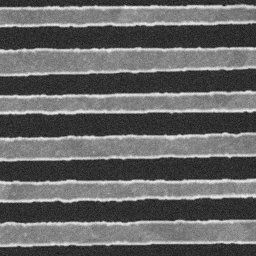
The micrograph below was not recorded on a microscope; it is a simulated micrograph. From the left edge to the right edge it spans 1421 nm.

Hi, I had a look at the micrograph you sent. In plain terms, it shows lines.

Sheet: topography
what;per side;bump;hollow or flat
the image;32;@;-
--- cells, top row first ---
--------------------------------
@@@@@@@@@@@@@@@@@@@@@@@@@@@@@@@@
@@@@@@@@@@@@@@@@@@@@@@@@@@@@@@@@
--------------------------------
--------------------------------
--------------------------------
@@@@@@@@@@@@@@@@@@@@@@@@@@@@@@@@
@@@@@@@@@@@@@@@@@@@@@@@@@@@@@@@@
@@@@@@@@@@@@@@@@@@@@@@@@@@@@@@@-
--------------------------------
--------------------------------
--------------------------------
@@@@@@@@@@@@@@@@@@@@@@@@@@@@@@@@
@@@@@@@@@@@@@@@@@@@@@@@@@@@@@@@@
--------------------------------
--------------------------------
--------------------------------
@@@@@@@@@@@@@@@@@@@@@@@@@@@@@@@@
@@@@@@@@@@@@@@@@@@@@@@@@@@@@@@@@
@@@@@@@@@@@@@@@@@@@@@@@@-@------
--------------------------------
--------------------------------
--------------------------------
@@@@@@@@@@@@@@@@@@@@@@@@@@@@@@@@
@@@@@@@@@@@@@@@@@@@@@@@@@@@@@@@@
--------------------------------
--------------------------------
--------------------------------
@@@@@@@@@@@@@@@@@@@@@@@@@@@@@@@@
@@@@@@@@@@@@@@@@@@@@@@@@@@@@@@@@
@@@@@@@@@@@@@@@@@@@-------------
--------------------------------